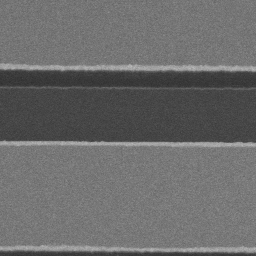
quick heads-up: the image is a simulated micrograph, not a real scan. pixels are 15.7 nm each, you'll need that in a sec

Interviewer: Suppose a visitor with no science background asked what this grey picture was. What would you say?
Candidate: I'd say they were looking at lines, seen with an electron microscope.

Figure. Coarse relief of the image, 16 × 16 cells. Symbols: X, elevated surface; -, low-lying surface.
XXXXXXXXXXXXXXXX
XXXXXXXXXXXXXXXX
XXXXXXXXXXXXXXXX
XXXXXXXXXXXXXXXX
----------------
----------------
----------------
----------------
----------------
XXXXXXXXXXXXXXXX
XXXXXXXXXXXXXXXX
XXXXXXXXXXXXXXXX
XXXXXXXXXXXXXXXX
XXXXXXXXXXXXXXXX
XXXXXXXXXXXXXXXX
XXXXXXXXXXXXXXXX